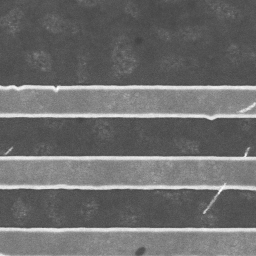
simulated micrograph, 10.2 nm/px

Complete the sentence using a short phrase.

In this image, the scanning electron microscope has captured one or a few lines or trenches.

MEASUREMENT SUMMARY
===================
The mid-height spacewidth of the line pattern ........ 41.8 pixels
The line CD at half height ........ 303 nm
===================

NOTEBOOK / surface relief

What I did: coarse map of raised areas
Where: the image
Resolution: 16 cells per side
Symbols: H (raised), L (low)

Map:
LLLLLLLLLLLLLLLL
LLLLLLLLLLLLLLLL
LLLLLLLLLLLLLLLL
LLLLLLLLLLLLLLLL
LLLLLLLLLLLLLLLL
HHHHHHHHHHHHHHHH
HHHHHHHHHHHHHHHH
LLLLLLLLLLLLLLLL
LLLLLLLLLLLLLLLL
LLLLLLLLLLLLLLLL
HHHHHHHHHHHHHHHH
HHHHHHHHHHHHHHHH
LLLLLLLLLLLLLLLL
LLLLLLLLLLLLLLLL
HHHHHHHHHHHHHHHH
HHHHHHHHHHHHHHHH